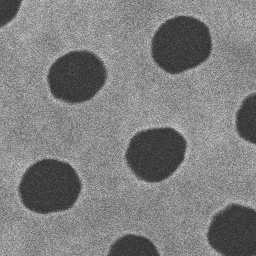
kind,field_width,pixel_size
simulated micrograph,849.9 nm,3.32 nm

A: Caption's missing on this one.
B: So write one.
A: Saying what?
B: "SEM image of holes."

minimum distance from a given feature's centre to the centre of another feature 365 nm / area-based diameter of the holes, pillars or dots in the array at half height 193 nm